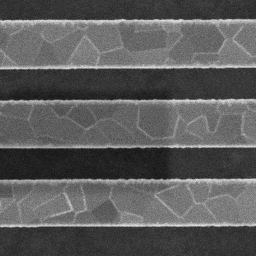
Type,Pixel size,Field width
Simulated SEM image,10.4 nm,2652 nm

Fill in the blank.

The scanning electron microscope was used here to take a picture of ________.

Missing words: lines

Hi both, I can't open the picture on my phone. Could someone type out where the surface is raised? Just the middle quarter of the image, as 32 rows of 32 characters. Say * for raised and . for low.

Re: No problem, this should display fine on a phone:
********************************
................................
................................
................................
................................
................................
................................
................................
................................
********************************
********************************
********************************
********************************
********************************
********************************
********************************
********************************
********************************
********************************
********************************
********************************
................................
................................
................................
................................
................................
................................
................................
................................
********************************
********************************
********************************